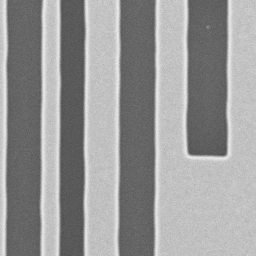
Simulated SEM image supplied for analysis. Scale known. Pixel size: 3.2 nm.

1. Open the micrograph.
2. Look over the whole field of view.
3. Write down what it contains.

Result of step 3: groups of lines, slits or small figures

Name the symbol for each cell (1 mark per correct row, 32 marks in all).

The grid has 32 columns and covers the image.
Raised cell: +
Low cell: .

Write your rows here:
+....+++...++++.....+++......+++
+....+++...++++.....+++......+++
+....+++...++++.....+++......+++
+....+++...++++.....+++......+++
+....+++...++++.....+++......+++
+....+++...++++.....+++......+++
+....+++...++++.....+++.....++++
+....+++...++++.....+++.....++++
+....+++...++++.....+++.....++++
+....+++...++++.....+++.....++++
+....+++...++++.....+++.....++++
+....+++...++++.....+++.....++++
+....+++...++++.....+++.....++++
+....+++...++++....++++.....++++
+....+++...++++....++++.....++++
+....+++...++++....++++.....++++
+....+++...++++....++++.....++++
+....++....++++....++++.....++++
+....++....++++....++++.....++++
+....++....++++.....+++++...++++
+....++....++++....+++++++++++++
+....++....++++....+++++++++++++
+....++....++++....+++++++++++++
+....++....++++....+++++++++++++
+....++...+++++....+++++++++++++
+....++...+++++....+++++++++++++
+....++...+++++....+++++++++++++
+....++....++++....+++++++++++++
+....++....++++....+++++++++++++
+....++....++++....+++++++++++++
+....++....++++....+++++++++++++
+....++....++++....+++++++++++++